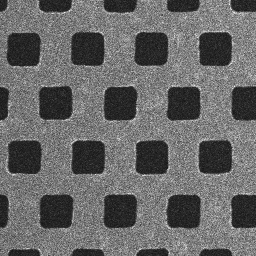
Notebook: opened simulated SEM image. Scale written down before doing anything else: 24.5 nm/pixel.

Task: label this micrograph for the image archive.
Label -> a regular array of holes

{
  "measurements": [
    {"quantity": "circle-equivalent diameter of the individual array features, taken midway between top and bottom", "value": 0.905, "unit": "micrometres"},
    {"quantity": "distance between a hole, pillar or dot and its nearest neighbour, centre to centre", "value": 1530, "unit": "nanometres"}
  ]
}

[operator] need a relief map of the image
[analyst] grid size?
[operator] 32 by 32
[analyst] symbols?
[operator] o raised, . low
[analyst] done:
.oooo....oooo....oooo....oooo...
oooooo..ooooo...ooooo...oooooooo
oooooooooooooooooooooooooooooooo
oooooooooooooooooooooooooooooooo
o....oooo....oooo....oooo....ooo
o....oooo....oooo....oooo....ooo
o....oooo....oooo....oooo....ooo
o....oooo....oooo....oooo....ooo
oooooooooooooooooooooooooooooooo
oooooooooooooooooooooooooooooooo
oooooooooooooooooooooooooooooooo
.oooo....oooo....oooo....oooo...
.oooo....oooo....oooo....oooo...
.oooo....oooo....oooo....oooo...
.oooo....oooo....oooo....oooo...
oooooooooooooooooooooooooooooooo
oooooooooooooooooooooooooooooooo
oo..oooooo.oooooooo.ooooooo.oooo
o....oooo....oooo....oooo....ooo
o....oooo....oooo....oooo....ooo
o....oooo....oooo....oooo....ooo
o....oooo....oooo....oooo....ooo
oooooooooooooooooooooooooooooooo
oooooooooooooooooooooooooooooooo
.ooooo...oooo....oooo....oooo...
.oooo....oooo....oooo....oooo...
.oooo....oooo....oooo....oooo...
.oooo....oooo....oooo....oooo...
oooooo..oooooo.ooooooo..oooooo..
oooooooooooooooooooooooooooooooo
oooooooooooooooooooooooooooooooo
o....oooo....oooo....oooo....ooo